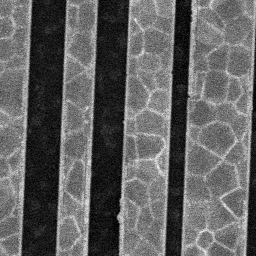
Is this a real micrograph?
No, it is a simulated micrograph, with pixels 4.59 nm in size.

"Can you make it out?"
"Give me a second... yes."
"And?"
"one or a few lines or trenches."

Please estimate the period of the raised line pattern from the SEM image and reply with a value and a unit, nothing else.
0.324 µm